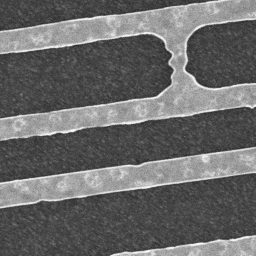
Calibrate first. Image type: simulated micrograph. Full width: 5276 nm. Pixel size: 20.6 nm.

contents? one or a few lines or trenches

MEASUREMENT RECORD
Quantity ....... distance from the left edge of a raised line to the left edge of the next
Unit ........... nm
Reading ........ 1520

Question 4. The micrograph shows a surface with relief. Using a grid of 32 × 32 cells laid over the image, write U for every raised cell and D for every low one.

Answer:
DDDDDDDDDDDDDDDDDDDDDDDDDUUUUUUU
DDDDDDDDDDDDDDDDDDUUUUUUUUUUUUUU
DDDDDDDDDDUUUUUUUUUUUUUUUUUUUUUD
DDDUUUUUUUUUUUUUUUUUUUUUUDDDDDDD
UUUUUUUUUUUUUUUUDDDDUUUUDDDDDDDD
UUUUUUUUUUDDDDDDDDDDDUUDDDDDDDDD
UUDDDDDDDDDDDDDDDDDDDUUDDDDDDDDD
DDDDDDDDDDDDDDDDDDDDDUUDDDDDDDDD
DDDDDDDDDDDDDDDDDDDDDDUDDDDDDDDD
DDDDDDDDDDDDDDDDDDDDDDUUDDDDDDDD
DDDDDDDDDDDDDDDDDDDDDUUUUDDDDDDD
DDDDDDDDDDDDDDDDDDDDUUUUUUUUUUUU
DDDDDDDDDDDDDDDDDUUUUUUUUUUUUUUU
DDDDDDDDDDUUUUUUUUUUUUUUUUUUUDDD
DDUUUUUUUUUUUUUUUUUUUUUDDDDDDDDD
UUUUUUUUUUUUUUDDDDDDDDDDDDDDDDDD
UUUUUUUUDDDDDDDDDDDDDDDDDDDDDDDD
DDDDDDDDDDDDDDDDDDDDDDDDDDDDDDDD
DDDDDDDDDDDDDDDDDDDDDDDDDDDDDDDU
DDDDDDDDDDDDDDDDDDDDDDDDUUUUUUUU
DDDDDDDDDDDDDDDDDDUUUUUUUUUUUUUU
DDDDDDDDDDUUUUUUUUUUUUUUUUUUUUUU
DDDUUUUUUUUUUUUUUUUUUUUUDDDDDDDD
UUUUUUUUUUUUUUUUUUDDDDDDDDDDDDDD
UUUUUUUUUUUDDDDDDDDDDDDDDDDDDDDD
UUUDDDDDDDDDDDDDDDDDDDDDDDDDDDDD
DDDDDDDDDDDDDDDDDDDDDDDDDDDDDDDD
DDDDDDDDDDDDDDDDDDDDDDDDDDDDDDDD
DDDDDDDDDDDDDDDDDDDDDDDDDDDDDDDD
DDDDDDDDDDDDDDDDDDDDDDDDDDDDDDDD
DDDDDDDDDDDDDDDDDDDDDDDDDUUUUUUU
DDDDDDDDDDDDDDDDDDUUUUUUUUUUUUUU